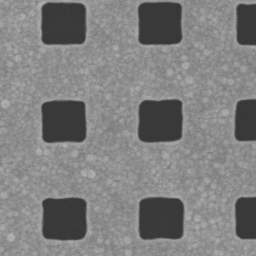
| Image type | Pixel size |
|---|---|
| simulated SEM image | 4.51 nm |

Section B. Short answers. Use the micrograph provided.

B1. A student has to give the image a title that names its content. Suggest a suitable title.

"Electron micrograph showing holes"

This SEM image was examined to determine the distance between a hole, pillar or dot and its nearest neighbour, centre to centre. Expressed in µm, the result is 0.436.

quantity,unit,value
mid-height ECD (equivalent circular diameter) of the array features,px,47.6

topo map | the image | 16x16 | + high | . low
+++..++++..++++.
+++..++++..++++.
+++..++++..++++.
++++++++++++++++
++++++++++++++++
++++++++++++++++
+++..++++..++++.
+++..++++..++++.
+++..++++..++++.
++++++++++++++++
++++++++++++++++
++++++++++++++++
+++..++++..++++.
+++..++++..++++.
+++..++++..++++.
++++++++++++++++